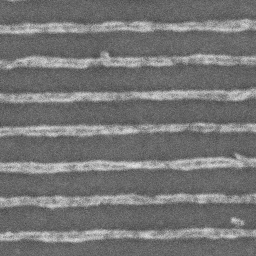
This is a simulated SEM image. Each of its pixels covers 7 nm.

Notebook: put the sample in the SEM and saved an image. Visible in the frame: parallel lines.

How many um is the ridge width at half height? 0.0446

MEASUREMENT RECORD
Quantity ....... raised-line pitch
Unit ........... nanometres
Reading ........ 242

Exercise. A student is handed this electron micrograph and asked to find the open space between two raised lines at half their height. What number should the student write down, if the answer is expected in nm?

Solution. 199